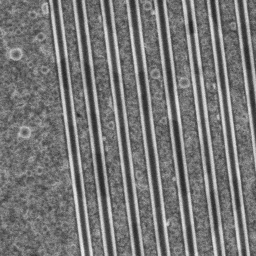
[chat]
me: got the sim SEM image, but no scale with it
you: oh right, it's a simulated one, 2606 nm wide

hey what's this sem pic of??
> parallel lines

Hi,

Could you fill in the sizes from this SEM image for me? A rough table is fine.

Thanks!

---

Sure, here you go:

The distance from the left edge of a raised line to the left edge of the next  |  265 nanometers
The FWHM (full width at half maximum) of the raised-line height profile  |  8.8 pixels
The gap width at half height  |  178 nm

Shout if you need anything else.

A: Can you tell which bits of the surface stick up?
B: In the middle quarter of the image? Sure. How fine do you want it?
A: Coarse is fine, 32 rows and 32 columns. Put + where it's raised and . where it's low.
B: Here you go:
+....++.....++....++.....++.....
+....++.....++....++.....++.....
+....++.....++....++.....++.....
+....++.....++....+++....++.....
+....++.....++....+++....+++..+.
++...++.....++.....++....+++....
++...+++....++.....++.....++....
++...+++....+++....++.....++....
++....++.....++....++.....++....
++....++.....++....++.....++....
++....++.....++....+++....++....
++....++.....++....+++....++....
++....++.....++....+++....+++...
+++...++.....++.....++....+++...
.++...+++....++.....++.....++...
.++...+++....+++....++.....++...
.++....++.....++....++.....++...
.++....++.....++....++.....++...
.++....++.....++....+++....++...
.++....++.....++....+++....++...
.++....++.....++....+++....+++..
.+++...+++....++.....++....+++..
..++...+++....++.....++.....++..
..++...+++....+++....++.....++..
..++....++.....++....++.....++..
..++....++.....++....++.....++..
..++....++.....++....+++....++..
..++....++.....++....+++....++..
..++....++.....++.....++....+++.
..+++...++.....++.....++....+++.
...++...+++....++.....++.....++.
...++...+++.....++....++.....++.